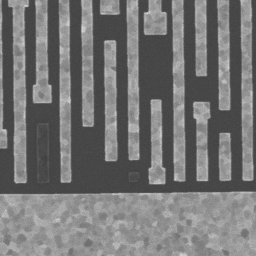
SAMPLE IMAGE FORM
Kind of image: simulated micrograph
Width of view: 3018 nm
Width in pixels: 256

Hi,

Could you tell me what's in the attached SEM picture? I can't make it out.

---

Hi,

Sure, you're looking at wiring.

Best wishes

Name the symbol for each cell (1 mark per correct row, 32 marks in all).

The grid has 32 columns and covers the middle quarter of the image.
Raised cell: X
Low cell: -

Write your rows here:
X----XX---XXX---XX---------XXX--
X----XX---XXX---XX---------XXX--
X----XX---XXX---XX---------XXX--
X----XX---XXX---XX---------XXX--
X----XX---XXX---XX---------XXX--
X----XX---XXX---XX---------XXX--
X----XX---XXX---XX---------XXX--
X----XX---XXX---XX---------XXX--
XX---XX---XXX---XXX--------XXX--
XX---XX---XXX---XXX---XX---XXX--
XX---XX---XXX---XXX---XX---XXX--
XX---XX---XXX---XXX---XX---XXX--
XX---XX---XXX---XXX---XX----XX--
XX---XX----XX---XX----XX----XX--
XX---XX----XX---XX----XX----XX--
XX---------XX---XX----XX----XX--
XX--------XXX---XXX---XX----XX--
XX--------XXX---XXX---XX----XX--
XX--------XXX---XXX---XX----XX--
XX--------XXX---XXX---XX----XX--
XX--------XXX---XXX---XX----XX--
XX--------XXX---XXX---XX----XX--
XX---------XX---XXX---XX----XX--
XX---------XX---XXX---XX----XX--
XX--------------------XX----XX--
XX--------------------XX----XX--
XX-------------------XXXX---XX--
XX--------------XXX--XXXX---XX--
XX--------------XXX--XXXX---XX--
X--------------------XXXX-------
--------------------------------
--------------------------------